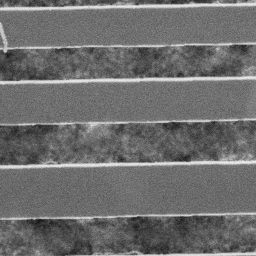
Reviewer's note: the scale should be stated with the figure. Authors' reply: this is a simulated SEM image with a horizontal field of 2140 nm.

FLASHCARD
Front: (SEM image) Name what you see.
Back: lines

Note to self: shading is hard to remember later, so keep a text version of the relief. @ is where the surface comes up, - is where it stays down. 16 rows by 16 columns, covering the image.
----@@@@@@@@@@@@
@@@@@@@@@@@@@@@@
@@@@@@@@@@@@@@@@
----------------
----------------
@@@@@@@@@@@@@@@@
@@@@@@@@@@@@@@@@
@@@@@@@@@@@@@@@-
----------------
----------------
@@@@@@@@@@@@@@@@
@@@@@@@@@@@@@@@@
@@@@@@@@@@@@@@@@
@@@@@@@@@-------
----------------
----------------